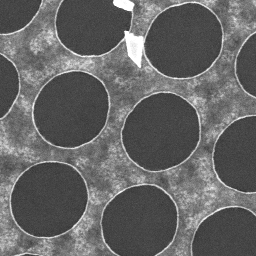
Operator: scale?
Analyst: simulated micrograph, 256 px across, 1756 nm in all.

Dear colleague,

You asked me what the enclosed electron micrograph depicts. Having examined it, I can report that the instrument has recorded holes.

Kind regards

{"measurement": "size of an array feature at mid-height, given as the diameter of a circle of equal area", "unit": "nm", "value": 529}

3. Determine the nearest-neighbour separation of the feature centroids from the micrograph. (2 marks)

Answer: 0.635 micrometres